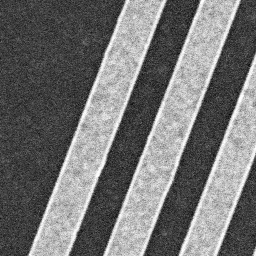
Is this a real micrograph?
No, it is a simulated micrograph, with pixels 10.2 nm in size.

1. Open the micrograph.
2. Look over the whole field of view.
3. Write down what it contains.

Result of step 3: one or a few lines or trenches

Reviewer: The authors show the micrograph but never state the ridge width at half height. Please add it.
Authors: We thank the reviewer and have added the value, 33.5 px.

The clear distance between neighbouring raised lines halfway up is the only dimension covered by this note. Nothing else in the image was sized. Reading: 362 nm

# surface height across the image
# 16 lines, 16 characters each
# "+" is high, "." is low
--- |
........++..+++.
.......+++..++..
.......++...++..
.......++..+++..
......+++..++...
......++...++..+
......++..++...+
.....++...++..++
.....++..+++..++
....+++..++...++
....++...++..+++
....++..+++..++.
...+++..++...++.
...++...++..++..
..+++..++...++..
..++...++..+++..